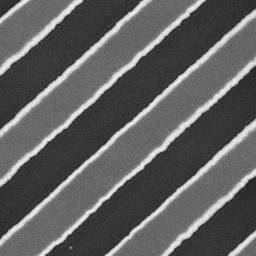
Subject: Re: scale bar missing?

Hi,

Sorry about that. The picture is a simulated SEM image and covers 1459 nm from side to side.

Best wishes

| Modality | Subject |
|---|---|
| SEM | lines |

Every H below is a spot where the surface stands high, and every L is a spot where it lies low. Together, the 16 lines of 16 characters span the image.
LHHHHLLLHHHHLLLL
HHHHLLLHHHHLLLLH
HHHLLLHHHHLLLLHH
HLLLLHHHHLLLLHHH
LLLLHHHHLLLLHHHL
LLLHHHHLLLHHHHLL
LLHHHHLLLHHHHLLL
LHHHHLLLHHHHLLLL
HHHLLLLHHHHLLLLH
HHLLLLHHHHLLLLHH
HLLLLHHHHLLLLHHH
LLLLHHHHLLLLHHHL
LLLHHHHLLLHHHHLL
LLHHHHLLLHHHHLLL
HHHHLLLLHHHHLLLL
HHHLLLLHHHHLLLLH